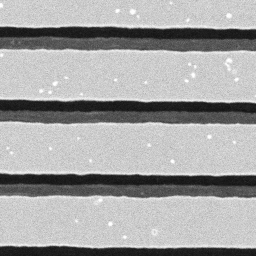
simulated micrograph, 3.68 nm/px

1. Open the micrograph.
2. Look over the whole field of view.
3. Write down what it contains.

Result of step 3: lines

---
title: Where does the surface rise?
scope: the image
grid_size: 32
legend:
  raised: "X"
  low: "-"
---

XXXXXXXXXXXXXXXXXXXXXXXXXXXXXXXX
XXXXXXXXXXXXXXXXXXXXXXXXXXXXXXXX
XXXXXXXXXXXXXXXXXXXXXXXXXXXXXXXX
----X-----------XXXXXXXXXXXXXXXX
--------------------------------
-----------------XX---X---------
XXXXXXXXXXXXXXXXXXXXXXXXXXXXXXXX
XXXXXXXXXXXXXXXXXXXXXXXXXXXXXXXX
XXXXXXXXXXXXXXXXXXXXXXXXXXXXXXXX
XXXXXXXXXXXXXXXXXXXXXXXXXXXXXXXX
XXXXXXXXXXXXXXXXXXXXXXXXXXXXXXXX
XXXXXXXXXXXXXXXXXXXXXXXXXXXXXXXX
---XXXXXXXXXXXXXXXXXXXXXXXXXXXXX
--------------------------------
X--X---------------XXX----------
XXXXXX-----XXXXXXXXXXXX---------
XXXXXXXXXXXXXXXXXXXXXXXXXXXXXXXX
XXXXXXXXXXXXXXXXXXXXXXXXXXXXXXXX
XXXXXXXXXXXXXXXXXXXXXXXXXXXXXXXX
XXXXXXXXXXXXXXXXXXXXXXXXXXXXXXXX
XXXXXXXXXXXXXXXXXXXXXXXXXXXXXXXX
XXXXXXXXXXXXXXXXXXXXXXXXXXXXXXXX
--------------------------------
--------------------------------
------------------------------XX
XXXXXXXXXXXXXXXXXXXXXXXXXXXXXXXX
XXXXXXXXXXXXXXXXXXXXXXXXXXXXXXXX
XXXXXXXXXXXXXXXXXXXXXXXXXXXXXXXX
XXXXXXXXXXXXXXXXXXXXXXXXXXXXXXXX
XXXXXXXXXXXXXXXXXXXXXXXXXXXXXXXX
XXXXXXXXXXXXXXXXXXXXXXXXXXXXXXXX
--------------------------------